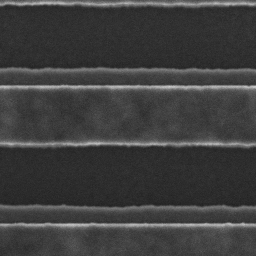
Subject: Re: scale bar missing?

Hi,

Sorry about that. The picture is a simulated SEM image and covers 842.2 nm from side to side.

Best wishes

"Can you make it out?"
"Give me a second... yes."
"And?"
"lines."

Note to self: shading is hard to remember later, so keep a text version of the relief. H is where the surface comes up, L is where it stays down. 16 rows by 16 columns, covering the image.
LLLLLLLLLLLLLLLL
LLLLLLLLLLLLLLLL
LLLLLLLLLLLLLLLL
LLLLLLLLLLLLLLLL
HHHHHHHHHHHHHHHH
HHHHHHHHHHHHHHHH
HHHHHHHHHHHHHHHH
HHHHHHHHHHHHHHHH
HHHHHHHHHHHHHHHH
LLLLLLLLLLLLLLLL
LLLLLLLLLLLLLLLL
LLLLLLLLLLLLLLLL
LLLLLLLLLLLLLLLL
HHHHHHHHHHHHHHHH
HHHHHHHHHHHHHHHH
HHHHHHHHHHHHHHHH